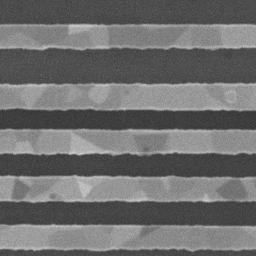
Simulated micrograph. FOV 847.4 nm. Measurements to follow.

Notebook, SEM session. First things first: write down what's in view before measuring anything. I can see lines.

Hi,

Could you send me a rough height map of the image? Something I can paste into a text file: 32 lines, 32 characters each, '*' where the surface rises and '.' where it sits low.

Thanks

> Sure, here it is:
................................
................................
................................
********************************
********************************
********************************
................................
................................
................................
................................
...........*.....*.....**.**.**.
********************************
********************************
********************************
................................
................................
********************************
********************************
********************************
................................
................................
................................
********************************
********************************
********************************
................................
................................
................................
********************************
********************************
********************************
................................